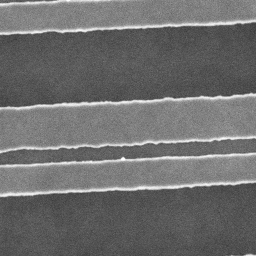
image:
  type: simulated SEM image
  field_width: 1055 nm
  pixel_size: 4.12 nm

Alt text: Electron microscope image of lines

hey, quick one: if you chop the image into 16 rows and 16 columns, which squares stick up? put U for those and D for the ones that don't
UUUUUUUUUUUUUUUU
UUUUUUUUUUUUUUDD
DDDDDDDDDDDDDDDD
DDDDDDDDDDDDDDDD
DDDDDDDDDDDDDDDD
DDDDDDDDDDDDDDDD
DDDDDUUUUUUUUUUU
UUUUUUUUUUUUUUUU
UUUUUUUUUUUUUUUU
UUUUUUUUUUUUUUUU
UUUUUUUUUUUUUUUU
UUUUUUUUUUUUUUDD
DDDDDDDDDDDDDDDD
DDDDDDDDDDDDDDDD
DDDDDDDDDDDDDDDD
DDDDDDDDDDDDDDDD